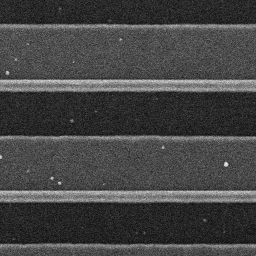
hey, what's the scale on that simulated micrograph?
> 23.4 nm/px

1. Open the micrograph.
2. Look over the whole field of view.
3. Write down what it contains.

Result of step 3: lines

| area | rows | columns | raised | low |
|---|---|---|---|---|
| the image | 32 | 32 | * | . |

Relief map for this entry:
................................
................................
................................
********************************
********************************
********************************
********************************
********************************
********************************
********************************
********************************
................................
................................
................................
................................
................................
................................
********************************
********************************
********************************
********************************
********************************
********************************
********************************
********************************
................................
................................
................................
................................
................................
................................
********************************